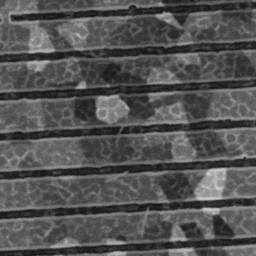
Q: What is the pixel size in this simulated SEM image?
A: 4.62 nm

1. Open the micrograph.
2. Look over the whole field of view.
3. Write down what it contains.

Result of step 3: parallel lines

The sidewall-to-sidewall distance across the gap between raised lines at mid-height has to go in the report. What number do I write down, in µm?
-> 0.0432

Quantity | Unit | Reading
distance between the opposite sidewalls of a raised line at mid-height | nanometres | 137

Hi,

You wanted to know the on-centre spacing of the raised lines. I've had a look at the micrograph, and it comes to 0.181 microns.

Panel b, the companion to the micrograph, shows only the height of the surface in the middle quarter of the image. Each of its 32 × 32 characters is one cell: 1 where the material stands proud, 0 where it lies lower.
11111111111111111111111111111111
11111111111111111111111111111111
11111111111111111111111111111111
11111111111111111111111111111111
11111111111111111111111111111100
11111111011000000000000000000000
00000000000000000000000000000000
00000000000000000000000111111111
00010111110111111111111111111111
11111111111111111111111111111111
11111111111111111111111111111111
11111111111111111111111111111111
11111111111111111111111111111111
11111111111111111111111111111111
11111111111111111111111111111101
11111111110000000000000000000000
00000000000000000000000000000000
00000000000001000000011111111111
00001111111111111111111111111111
11111111111111111111111111111111
11111111111111111111111111111111
11111111111111111111111111111111
11111111111111111111111111111111
11111111111111111111111111111111
11111111111111111111111100000000
11110001100000000000000000000000
00000000000000000000000000000000
00000000000000110001011111111111
11111111111111111111111111111111
11111111111111111111111111111111
11111111111111111111111111111111
11111111111111111111111111111111